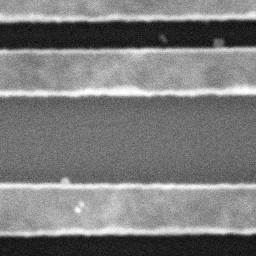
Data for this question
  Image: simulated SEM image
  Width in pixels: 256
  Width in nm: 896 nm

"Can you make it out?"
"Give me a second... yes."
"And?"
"lines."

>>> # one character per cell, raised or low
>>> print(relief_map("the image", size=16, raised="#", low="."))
################
................
................
################
################
################
................
................
................
................
................
................
################
################
################
................